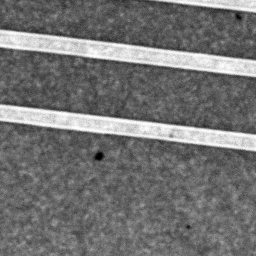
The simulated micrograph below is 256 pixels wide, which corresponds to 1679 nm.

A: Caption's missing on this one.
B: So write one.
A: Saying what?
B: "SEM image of one or a few lines or trenches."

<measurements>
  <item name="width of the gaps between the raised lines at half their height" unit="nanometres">393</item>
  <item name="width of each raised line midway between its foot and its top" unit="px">14.3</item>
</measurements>